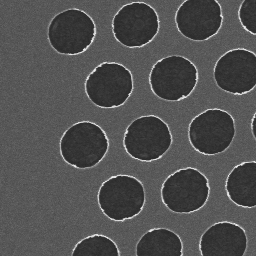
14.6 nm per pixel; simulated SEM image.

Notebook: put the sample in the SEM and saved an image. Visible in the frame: a regular array of holes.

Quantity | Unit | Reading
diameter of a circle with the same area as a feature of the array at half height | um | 0.65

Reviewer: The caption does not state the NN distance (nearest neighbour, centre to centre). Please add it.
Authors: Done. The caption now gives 940 nm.